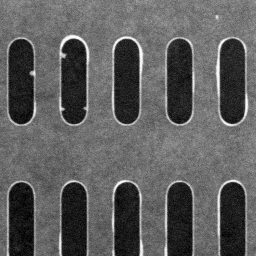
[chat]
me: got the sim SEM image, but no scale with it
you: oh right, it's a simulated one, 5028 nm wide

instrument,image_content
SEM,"groups of lines, slits or small figures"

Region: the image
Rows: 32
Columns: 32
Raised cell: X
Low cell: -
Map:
XXXXXXXXXXXXXXXXXXXXXXXXXXXXXXXX
XXXXXXXXXXXXXXXXXXXXXXXXXXXXXXXX
XXXXXXXXXXXXXXXXXXXXXXXXXXXXXXXX
XXXXXXXXXXXXXXXXXXXXXXXXXXXXXXXX
XXXXXXXXXXXXXXXXXXXXXXXXXXXXXXXX
X---XXXX---XXX---XXXX---XXXX--XX
X---XXXX---XXX----XXX---XXX----X
X---XXX----XXX----XXX---XXX----X
X---XXX----XXX----XXX---XXX----X
X---XXX----XXX----XXX---XXX----X
X---XXX----XXX----XXX---XXX----X
X---XXX----XXX----XXX---XXX----X
X---XXX----XXX----XXX---XXX----X
X---XXXX---XXX----XXX---XXX----X
X---XXXX---XXX---XXXX---XXXX---X
XX-XXXXXX-XXXXXXXXXXXX-XXXXXXXXX
XXXXXXXXXXXXXXXXXXXXXXXXXXXXXXXX
XXXXXXXXXXXXXXXXXXXXXXXXXXXXXXXX
XXXXXXXXXXXXXXXXXXXXXXXXXXXXXXXX
XXXXXXXXXXXXXXXXXXXXXXXXXXXXXXXX
XXXXXXXXXXXXXXXXXXXXXXXXXXXXXXXX
XXXXXXXXXXXXXXXXXXXXXXXXXXXXXXXX
XXXXXXXXXXXXXXXXXXXXXXXXXXXXXXXX
X---XXXX---XXX---XXXX---XXXX--XX
X---XXXX---XXX---XXXX---XXX----X
X---XXXX---XXX----XXX---XXX----X
X---XXXX---XXX----XXX---XXX----X
X---XXXX---XXX----XXX---XXX----X
X---XXXX---XXX----XXX---XXX----X
X---XXX----XXX----XXX---XXX----X
X---XXX----XXX----XXX---XXX----X
X---XXXX---XXX----XXX---XXX----X